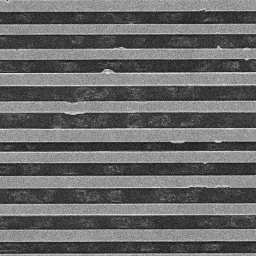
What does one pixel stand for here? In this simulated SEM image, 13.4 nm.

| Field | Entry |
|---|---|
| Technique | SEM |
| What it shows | parallel lines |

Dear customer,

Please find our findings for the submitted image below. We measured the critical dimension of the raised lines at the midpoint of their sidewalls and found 148 nm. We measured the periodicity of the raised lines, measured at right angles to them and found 0.346 µm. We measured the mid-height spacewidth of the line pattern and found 188 nm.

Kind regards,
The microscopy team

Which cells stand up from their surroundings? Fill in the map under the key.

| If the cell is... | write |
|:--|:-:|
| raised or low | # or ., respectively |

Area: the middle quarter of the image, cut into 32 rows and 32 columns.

................................
..........##....................
################################
################################
################################
................................
................................
................................
................................
............................####
################################
################################
.##.............................
................................
................................
................................
################################
################################
################################
................................
................................
................................
################################
################################
########........................
................................
................................
................................
################################
################################
################################
................................